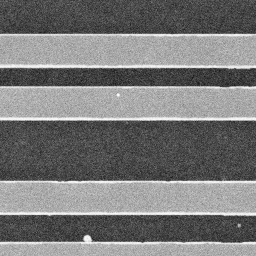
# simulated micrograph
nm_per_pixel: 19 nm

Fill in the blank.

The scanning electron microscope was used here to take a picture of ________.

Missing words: lines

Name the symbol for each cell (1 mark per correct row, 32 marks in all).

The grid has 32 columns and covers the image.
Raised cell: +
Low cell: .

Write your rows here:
................................
................................
................................
................................
++++++++++++++++++++++++++++++++
++++++++++++++++++++++++++++++++
++++++++++++++++++++++++++++++++
++++++++++++++++++++++++++++++++
................................
................................
................................
++++++++++++++++++++++++++++++++
++++++++++++++++++++++++++++++++
++++++++++++++++++++++++++++++++
++++++++++++++++++++++++++++++++
................................
................................
................................
................................
................................
................................
................................
................................
++++++++++++++++++++++++++++++++
++++++++++++++++++++++++++++++++
++++++++++++++++++++++++++++++++
++++++++++++++++++++++++++++++++
................................
................................
................................
++++++++++++++++++++++++++++++++
++++++++++++++++++++++++++++++++